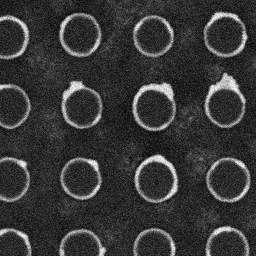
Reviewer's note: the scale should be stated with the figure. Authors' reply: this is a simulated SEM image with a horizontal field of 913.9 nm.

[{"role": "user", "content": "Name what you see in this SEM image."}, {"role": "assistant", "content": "a regular array of raised bodies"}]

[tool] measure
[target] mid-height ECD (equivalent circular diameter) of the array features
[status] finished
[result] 0.153 micrometres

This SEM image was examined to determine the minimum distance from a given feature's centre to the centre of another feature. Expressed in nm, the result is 254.